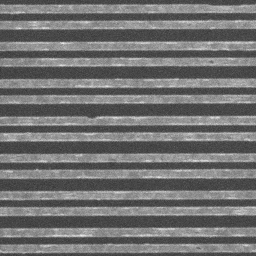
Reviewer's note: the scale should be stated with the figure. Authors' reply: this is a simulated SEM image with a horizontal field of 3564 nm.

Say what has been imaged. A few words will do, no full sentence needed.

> parallel lines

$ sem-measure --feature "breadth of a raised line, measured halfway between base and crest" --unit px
7.5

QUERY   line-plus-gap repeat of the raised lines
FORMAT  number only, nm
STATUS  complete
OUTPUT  256